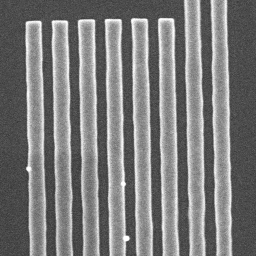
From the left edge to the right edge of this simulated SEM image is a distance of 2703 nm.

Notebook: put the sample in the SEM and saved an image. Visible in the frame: groups of lines, slits or small figures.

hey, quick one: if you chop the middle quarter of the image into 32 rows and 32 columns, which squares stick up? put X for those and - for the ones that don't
X---XXXX---XXX---XXXX---XXXX--XX
X---XXXX---XXX---XXXX---XXXX--XX
X---XXXX---XXX---XXXX---XXXX--XX
X---XXXX---XXX---XXXX---XXXX--XX
X---XXXX---XXX---XXXX---XXXX---X
X---XXXX---XXX---XXXX---XXXX---X
X---XXXX---XXX---XXXX---XXXX---X
X---XXXX---XXX---XXXX---XXXX---X
X---XXXX---XXXX--XXXX---XXXX---X
X---XXXX---XXXX--XXXX---XXXX---X
X---XXXX---XXXX--XXXX---XXXX---X
X---XXXX---XXXX--XXXX---XXXX---X
X---XXXX---XXXX--XXXX---XXXX---X
X---XXXX---XXXX--XXXX---XXXX---X
X---XXXX---XXXX--XXXX---XXXX---X
XX--XXXX---XXXX---XXX---XXXX---X
XX--XXXX---XXXX---XXX---XXXX---X
XX--XXXX---XXXX---XXX---XXXX---X
XX--XXXX---XXXX---XXX---XXXX---X
X---XXXX---XXXX---XXX---XXXX---X
XX--XXXX---XXXX---XXX---XXXX---X
XX--XXXX---XXXX---XXX---XXXX---X
XX--XXXX---XXXX---XXX---XXXX---X
XX--XXXX---XXXX---XXX---XXXX---X
XX--XXXX---XXXX---XXX---XXXX---X
XX--XXXX---XXXX---XXX---XXXX---X
XX--XXXX---XXXX---XXXX--XXXX---X
XX--XXXX---XXXX---XXX---XXXX---X
XX--XXXX---XXXX---XXXX--XXXX---X
XX--XXXX---XXXX---XXXX---XXX---X
XX--XXXX---XXXX---XXXX---XXX---X
XX--XXXX---XXXX---XXXX---XXX---X